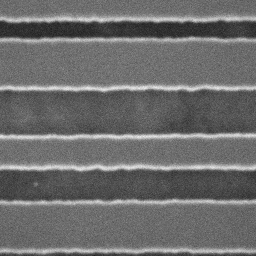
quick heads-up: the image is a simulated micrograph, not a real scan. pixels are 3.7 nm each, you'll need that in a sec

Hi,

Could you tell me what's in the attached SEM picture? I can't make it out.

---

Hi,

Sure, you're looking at lines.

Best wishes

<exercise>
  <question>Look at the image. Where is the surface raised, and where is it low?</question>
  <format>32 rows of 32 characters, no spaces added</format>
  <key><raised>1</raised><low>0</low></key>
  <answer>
11111111111111111111111111111111
11111111111111111111111111111111
11111111111111111111111111111111
00000000000000000000000000000000
00000000000000000000000000000000
11111111111111111111111111111111
11111111111111111111111111111111
11111111111111111111111111111111
11111111111111111111111111111111
11111111111111111111111111111111
11111111111111111111111111111111
00000000000000000000000000000000
00000000000000000000000000000000
00000000000000000000000000000000
00000000000000000000000000000000
00000000000000000000000000000000
00000000000000000000000000000000
11111111111111111111111111111111
11111111111111111111111111111111
11111111111111111111111111111111
11111111111111111111111111111111
00000000000000000000000000000000
00000000000000000000000000000000
00000000000000000000000000000000
00000000000000000000000000000000
11111111111111111111111111111111
11111111111111111111111111111111
11111111111111111111111111111111
11111111111111111111111111111111
11111111111111111111111111111111
11111111111111111111111111111111
11111110101111111100110011111111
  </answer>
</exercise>